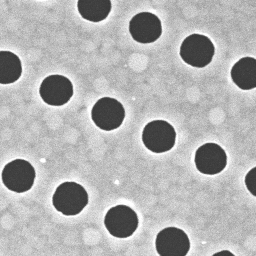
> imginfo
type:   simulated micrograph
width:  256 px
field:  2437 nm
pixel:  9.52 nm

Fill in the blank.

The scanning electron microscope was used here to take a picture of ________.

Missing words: a regular array of holes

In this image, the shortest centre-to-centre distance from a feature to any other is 536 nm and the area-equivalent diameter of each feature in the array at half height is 34.3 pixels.